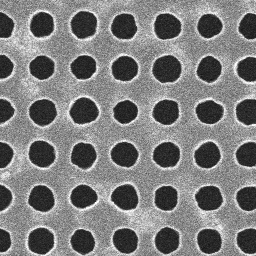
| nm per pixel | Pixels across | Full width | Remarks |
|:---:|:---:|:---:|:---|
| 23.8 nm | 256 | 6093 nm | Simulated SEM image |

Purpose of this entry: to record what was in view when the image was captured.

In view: a regular array of holes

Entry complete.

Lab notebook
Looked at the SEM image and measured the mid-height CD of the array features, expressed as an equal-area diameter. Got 0.625 micrometres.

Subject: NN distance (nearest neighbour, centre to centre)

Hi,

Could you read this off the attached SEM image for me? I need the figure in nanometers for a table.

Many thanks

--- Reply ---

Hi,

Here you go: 983